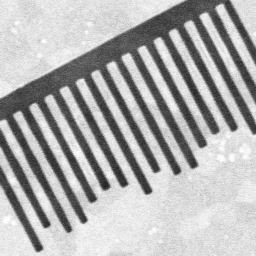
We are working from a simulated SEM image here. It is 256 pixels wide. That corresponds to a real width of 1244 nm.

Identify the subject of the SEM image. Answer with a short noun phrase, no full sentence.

groups of lines, slits or small figures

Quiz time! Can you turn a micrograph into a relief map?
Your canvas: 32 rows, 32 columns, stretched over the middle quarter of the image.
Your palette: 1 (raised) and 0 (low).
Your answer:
00000000000110001100011000110001
00000000000110001100011100110001
00000001100011000110001100011000
00000000100011100110001100011000
00001000110001100011000110001100
00001100110001110011100110001100
10001100011000110001100011000110
11000110011000111001110011000111
11000110001100011000110001100011
01100011001110011100111001100011
01100011000110001100011000110001
00110001100111001110011100111001
00110001100011000111001100011000
00011000110001100011000110001100
10011000110001100011000110001100
10001100011000110001100011000110
10000110011000110001100011000110
11000110001100011000110001100011
11000011001100011000111001100011
01100011000110001100011000110001
01110001000110001110011100110001
00110001100011000110001100011000
00011000110011100111001100011000
00011000110001100011000110001100
10001100111001110011100111001110
10001100011000110001100011000110
11000110011100111000110011100111
11000110001100011000111111100111
01100011000110001100011111111111
01110011000110001100011111111111
00110001100011001110001111111111
00111001100111111111001111111111